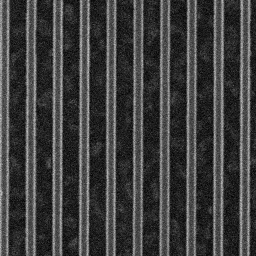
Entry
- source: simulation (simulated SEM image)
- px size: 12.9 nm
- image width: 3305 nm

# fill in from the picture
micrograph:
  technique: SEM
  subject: parallel lines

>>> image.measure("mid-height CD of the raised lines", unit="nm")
103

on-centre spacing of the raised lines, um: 0.345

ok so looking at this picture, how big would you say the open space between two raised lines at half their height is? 240 nm